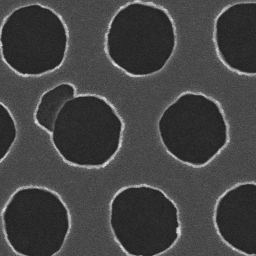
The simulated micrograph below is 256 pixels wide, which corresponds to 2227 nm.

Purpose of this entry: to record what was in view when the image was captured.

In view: holes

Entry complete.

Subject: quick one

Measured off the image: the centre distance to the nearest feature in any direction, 0.876 um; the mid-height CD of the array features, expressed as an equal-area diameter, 596 nm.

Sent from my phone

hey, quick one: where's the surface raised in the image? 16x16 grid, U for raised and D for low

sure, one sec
UDDUUUUUDDUUUUDD
DDDDUUUDDDDUUUDD
DDDDUUUDDDDUUUDD
DDDDUUUDDDDUUUDD
UDDUUUUUDDUUUUUD
UUUDUUUUUUUUUUUU
UUDDDDDUUUUDDUUU
DUDDDDDUUUDDDDUU
DUUDDDDUUUDDDDUU
UUUUDDDUUUUDDDUU
UUUUUUUUUUUUUUUU
UUUUUUUUUUUUUUUU
UDDDUUUDDDDUUUDD
DDDDUUUDDDDUUUDD
DDDDUUUDDDDUUUDD
UDDDUUUUDDUUUUUD